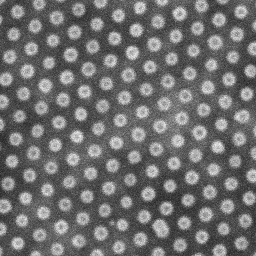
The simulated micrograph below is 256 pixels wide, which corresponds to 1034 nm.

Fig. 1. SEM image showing a regular array of raised bodies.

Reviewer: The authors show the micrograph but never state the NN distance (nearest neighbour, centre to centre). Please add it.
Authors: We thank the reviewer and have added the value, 22.7 px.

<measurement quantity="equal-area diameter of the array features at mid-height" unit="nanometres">43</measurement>